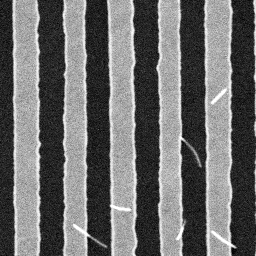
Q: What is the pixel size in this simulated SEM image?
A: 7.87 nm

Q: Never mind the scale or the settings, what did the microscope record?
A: lines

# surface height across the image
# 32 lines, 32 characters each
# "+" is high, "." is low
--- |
..+++...+++..++++...++....+++...
..+++...+++...+++...+++...+++...
..+++...+++...+++...+++...+++...
..+++...+++...+++...++....+++...
..+++...+++...+++...++....+++...
..+++...+++...+++...++....+++...
..+++...+++...+++...+++...+++...
..+++...+++...+++...+++...+++...
..+++...+++...+++...+++...+++...
..+++...+++...+++...+++...+++...
..+++...+++...+++...+++...+++...
..+++...+++...+++...+++...+++...
..+++...+++...+++...+++...+++...
..+++...+++...+++...+++...+++...
..+++...+++...+++...+++...+++...
..+++...+++...+++...+++...+++...
..+++...+++...+++...+++...+++...
..+++...+++...+++...+++...+++...
..+++...+++...+++...+++...+++...
..+++...+++...+++...+++...+++...
..+++...+++...+++...+++...+++...
..+++...+++...+++...+++...+++...
..+++...+++...+++...+++...+++...
..+++...+++...+++...+++...+++...
..+++...+++...+++...+++...+++...
..+++...+++...+++...+++...+++...
..+++...+++...+++...+++...+++...
..+++...+++...+++...+++...+++...
..+++...+++...+++...+++...+++...
..+++...+++...+++...+++...+++...
..+++...+++...+++...+++...+++...
..+++...+++...+++...+++...+++...